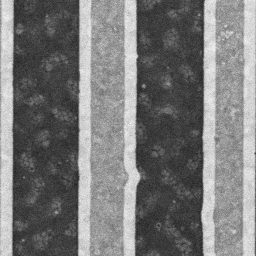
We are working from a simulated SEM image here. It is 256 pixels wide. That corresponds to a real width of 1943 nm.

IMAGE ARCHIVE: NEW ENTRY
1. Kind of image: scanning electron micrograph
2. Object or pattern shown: one or a few lines or trenches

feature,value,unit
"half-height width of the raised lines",317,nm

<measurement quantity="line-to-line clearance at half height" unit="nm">606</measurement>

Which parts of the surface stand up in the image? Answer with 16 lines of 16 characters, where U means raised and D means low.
DDDDDUUUDDDDDUUU
DDDDDUUUDDDDDUUU
DDDDDUUUDDDDDUUU
DDDDDUUUDDDDDUUU
DDDDDUUUDDDDDUUU
DDDDDUUUDDDDDUUU
DDDDDUUUDDDDDUUU
DDDDDUUUDDDDDUUU
DDDDDUUUDDDDDUUU
DDDDDUUUDDDDDUUU
DDDDDUUUDDDDDUUU
DDDDDUUUDDDDDUUU
DDDDDUUUDDDDDUUU
DDDDDUUUDDDDDUUU
DDDDDUUUDDDDDUUU
DDDDDUUUDDDDDUUU